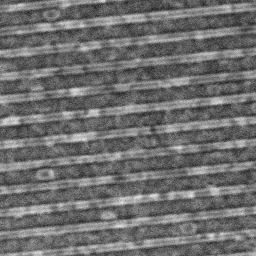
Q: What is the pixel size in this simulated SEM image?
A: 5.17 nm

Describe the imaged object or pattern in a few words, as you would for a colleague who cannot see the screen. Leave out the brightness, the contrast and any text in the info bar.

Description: parallel lines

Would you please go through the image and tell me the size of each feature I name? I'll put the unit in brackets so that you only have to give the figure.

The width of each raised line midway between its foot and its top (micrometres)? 0.0302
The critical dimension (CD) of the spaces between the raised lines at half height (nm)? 86.2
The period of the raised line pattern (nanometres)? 117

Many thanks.